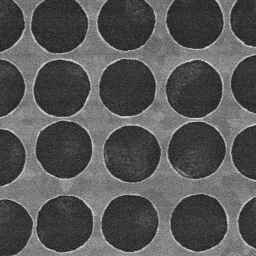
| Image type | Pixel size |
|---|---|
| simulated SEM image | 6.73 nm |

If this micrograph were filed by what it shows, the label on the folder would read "a regular array of holes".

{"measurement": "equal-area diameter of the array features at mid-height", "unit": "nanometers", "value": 389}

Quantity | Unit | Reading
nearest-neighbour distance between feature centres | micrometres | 0.435